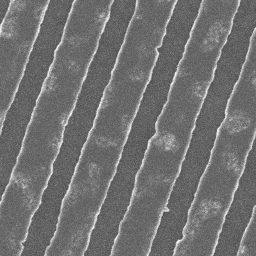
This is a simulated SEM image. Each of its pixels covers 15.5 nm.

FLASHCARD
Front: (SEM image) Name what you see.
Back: parallel lines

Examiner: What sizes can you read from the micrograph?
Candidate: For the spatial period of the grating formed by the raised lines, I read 928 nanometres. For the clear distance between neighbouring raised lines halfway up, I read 0.364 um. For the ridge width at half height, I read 560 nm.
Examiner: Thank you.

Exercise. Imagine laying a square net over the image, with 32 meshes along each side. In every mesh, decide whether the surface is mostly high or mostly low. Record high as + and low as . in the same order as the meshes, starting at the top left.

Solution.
.+++++...+++++...+++++...+++++..
.+++++...+++++...+++++...+++++..
+++++...+++++...+++++...+++++...
+++++...+++++...+++++...+++++...
+++++...+++++...++++....+++++..+
++++...+++++...+++++...+++++...+
++++...+++++...+++++...+++++...+
++++...++++....+++++...++++....+
+++...+++++...+++++...+++++...++
+++...+++++...+++++...+++++...++
++...+++++....++++...+++++...+++
++...+++++...+++++...+++++...+++
++...+++++...+++++...++++....+++
+...+++++...+++++...+++++...++++
+...+++++...+++++...+++++...++++
....++++....++++...+++++....++++
...+++++...+++++...+++++...+++++
...+++++...+++++...+++++...+++++
...+++++..+++++...+++++....++++.
..+++++...+++++...+++++...+++++.
..+++++...+++++...+++++...+++++.
..++++...+++++...+++++...+++++..
.+++++...+++++...+++++...+++++..
.+++++...+++++...+++++...+++++..
+++++...+++++...+++++...+++++...
+++++...+++++...+++++...+++++...
++++....++++....+++++...++++....
++++...+++++...+++++...+++++...+
++++...+++++...+++++...+++++...+
+++....++++....++++....++++...++
+++...+++++...+++++...+++++...++
+++...+++++...+++++...+++++...++